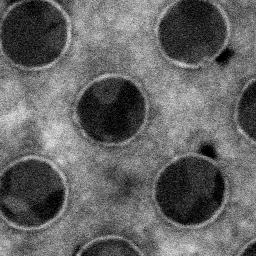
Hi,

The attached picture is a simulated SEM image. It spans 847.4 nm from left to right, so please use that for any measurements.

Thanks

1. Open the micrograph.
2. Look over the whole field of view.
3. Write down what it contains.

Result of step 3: raised bodies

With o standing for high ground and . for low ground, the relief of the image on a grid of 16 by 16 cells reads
.ooo......oooo..
oooo......oooo..
oooo......oooo..
oooo......oooo..
................
.....oooo......o
.....oooo......o
.....oooo......o
.....ooo.......o
................
ooo.......oooo..
oooo......oooo..
oooo......oooo..
oooo......ooo...
................
.....oooo......o